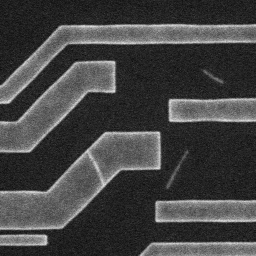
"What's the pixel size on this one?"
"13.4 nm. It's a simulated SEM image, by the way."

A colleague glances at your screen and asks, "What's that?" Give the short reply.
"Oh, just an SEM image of groups of lines, slits or small figures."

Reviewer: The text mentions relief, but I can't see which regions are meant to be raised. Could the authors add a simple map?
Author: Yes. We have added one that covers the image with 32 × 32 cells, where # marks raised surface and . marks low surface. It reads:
................................
................................
................................
.......#########################
......##########################
.....####.......................
....###.........................
...###..........................
..###....#####..................
.####...######..................
###....#######..................
##....#####.....................
#....#####.................#####
....#####............###########
...#####.............###########
#######.........................
######..........................
#####.......########............
####.......#########............
..........##########............
.........###########............
........#######.................
.......#######..................
......#######...................
############....................
###########.........############
##########..........############
#########...........############
#######.........................
######..........................
######.............#############
..................##############